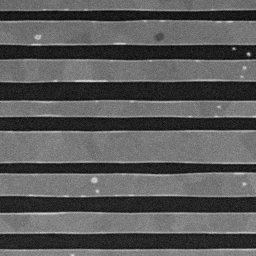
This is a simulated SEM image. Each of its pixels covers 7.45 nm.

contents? groups of lines, slits or small figures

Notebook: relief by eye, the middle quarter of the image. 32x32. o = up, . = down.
oooooooooooooooooooooooooooooooo
oooooooooooooooooooooooooooooooo
oooooooooooooooooooooooooooooooo
oooooooooooooooooooooooooooooooo
................................
................................
................................
................................
................................
....oooooooooooooooo...........o
oooooooooooooooooooooooooooooooo
oooooooooooooooooooooooooooooooo
oooooooooooooooooooooooooooooooo
................................
................................
................................
................................
oooooooooooooooooooooooooooooooo
oooooooooooooooooooooooooooooooo
oooooooooooooooooooooooooooooooo
oooooooooooooooooooooooooooooooo
oooooooooooooooooooooooooooooooo
oooooooooooooooooooooooooooooooo
oooooooooooooooooooooooooooooooo
ooo......oooooooooo........ooooo
................................
................................
................................
oooooooooooooooooooooooooooooooo
oooooooooooooooooooooooooooooooo
oooooooooooooooooooooooooooooooo
oooooooooooooooooooooooooooooooo